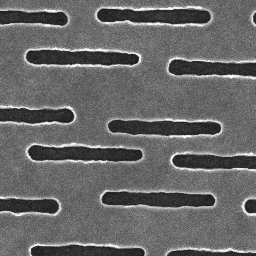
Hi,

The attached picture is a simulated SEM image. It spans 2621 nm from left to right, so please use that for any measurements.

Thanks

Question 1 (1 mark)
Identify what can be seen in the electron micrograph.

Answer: holes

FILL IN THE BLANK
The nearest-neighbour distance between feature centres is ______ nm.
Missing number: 860